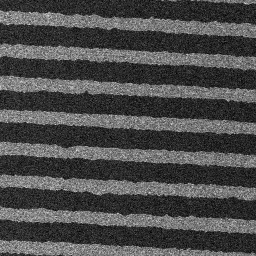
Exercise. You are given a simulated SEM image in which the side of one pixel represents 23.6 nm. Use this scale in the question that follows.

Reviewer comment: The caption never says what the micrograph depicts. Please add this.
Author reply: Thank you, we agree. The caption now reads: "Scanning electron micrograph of parallel lines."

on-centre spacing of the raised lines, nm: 772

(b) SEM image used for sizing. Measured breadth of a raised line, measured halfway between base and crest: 254 nm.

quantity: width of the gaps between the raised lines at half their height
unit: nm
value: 487